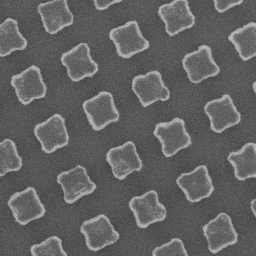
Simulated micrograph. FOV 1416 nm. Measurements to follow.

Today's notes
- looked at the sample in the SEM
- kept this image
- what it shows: a regular array of raised bodies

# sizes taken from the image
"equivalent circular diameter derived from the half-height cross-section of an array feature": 180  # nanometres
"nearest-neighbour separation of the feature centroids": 295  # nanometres